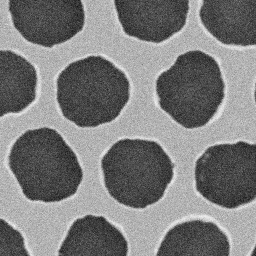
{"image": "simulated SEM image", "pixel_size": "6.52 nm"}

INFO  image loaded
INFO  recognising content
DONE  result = holes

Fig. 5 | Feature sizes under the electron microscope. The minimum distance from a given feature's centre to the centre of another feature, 588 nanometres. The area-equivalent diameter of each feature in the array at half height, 469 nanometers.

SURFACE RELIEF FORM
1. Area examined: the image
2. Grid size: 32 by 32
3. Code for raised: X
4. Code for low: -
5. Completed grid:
X---------XXXX----------X-------
X----------XXXX--------XX-------
X----------XXXX--------XX-------
XX--------XXXXX--------XXX------
XXX------XXXXXXX-----XXXXXX-----
XXXX---XXXXXXXXXXXXXXXXXXXXX----
--XXXXXXXXXXXXXXXXXXXXX--XXXXXXX
---XXXXXXX----XXXXXXXX-----XXXXX
----XXXX-------XXXXXX------XXXXX
-----XX---------XXXX--------XXXX
-----XX---------XXX---------XXXX
-----XX---------XXXX--------XXXX
----XXX---------XXXX--------XXXX
---XXXX--------XXXXX-------XXXXX
XXXXXXXX-------XXXXXX------XXXXX
XXXXXXXXX----XXXXXXXXX----XXXXXX
XXX----XXXXXXXXXXXXXXXXXXXXXXXXX
XX------XXXXXXX---XXXXXXXXXXXXXX
X--------XXXXX------XXXXXX------
X---------XXX--------XXXX-------
X---------XXX--------XXX--------
X---------XXX---------XX--------
XX--------XXX--------XXX--------
XXX-------XXX--------XXX--------
XXX------XXXXX------XXXXX-------
XXXXXXXXXXXXXXX----XXXXXXXX----X
XXXXXXXXXXXXXXXXXXXXXXXXXXXXXXXX
-XXXXXXXX----XXXXXXXXXX---XXXXXX
--XXXXXXX------XXXXXX-------XXXX
---XXXXX--------XXXXX-------XXXX
---XXXXX--------XXXX---------XXX
----XXX---------XXXX---------XX-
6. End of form